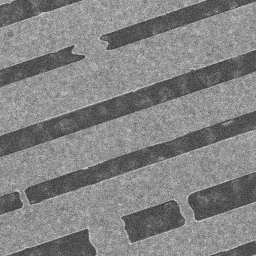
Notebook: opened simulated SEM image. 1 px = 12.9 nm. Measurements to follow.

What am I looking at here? one or a few lines or trenches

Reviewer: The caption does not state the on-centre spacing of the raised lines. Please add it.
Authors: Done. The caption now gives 771 nm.